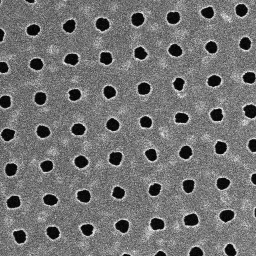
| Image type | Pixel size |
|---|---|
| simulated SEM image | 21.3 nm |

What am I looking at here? a regular array of holes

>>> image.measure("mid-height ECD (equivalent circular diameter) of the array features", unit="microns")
0.276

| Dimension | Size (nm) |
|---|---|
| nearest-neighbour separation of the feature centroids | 713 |